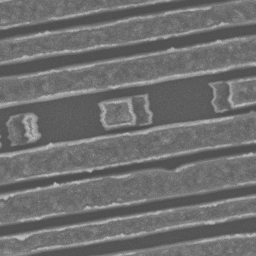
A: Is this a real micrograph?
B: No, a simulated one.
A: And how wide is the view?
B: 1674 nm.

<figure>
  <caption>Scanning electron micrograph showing parallel lines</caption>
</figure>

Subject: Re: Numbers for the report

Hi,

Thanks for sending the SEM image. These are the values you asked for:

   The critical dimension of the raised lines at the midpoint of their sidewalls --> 0.193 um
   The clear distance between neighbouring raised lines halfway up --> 70.1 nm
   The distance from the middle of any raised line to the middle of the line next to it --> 0.251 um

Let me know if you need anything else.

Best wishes